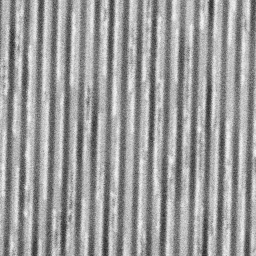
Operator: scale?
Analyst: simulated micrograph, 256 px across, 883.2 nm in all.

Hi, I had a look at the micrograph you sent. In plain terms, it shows parallel lines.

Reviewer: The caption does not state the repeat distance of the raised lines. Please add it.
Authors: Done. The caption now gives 48.8 nm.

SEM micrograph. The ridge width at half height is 22.4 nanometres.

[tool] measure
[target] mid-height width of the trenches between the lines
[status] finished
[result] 0.0254 µm